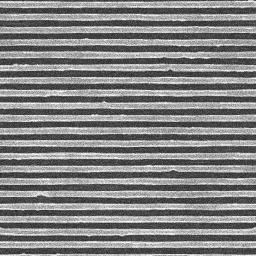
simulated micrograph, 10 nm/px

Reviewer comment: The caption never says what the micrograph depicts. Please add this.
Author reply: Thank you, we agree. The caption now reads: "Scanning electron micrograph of parallel lines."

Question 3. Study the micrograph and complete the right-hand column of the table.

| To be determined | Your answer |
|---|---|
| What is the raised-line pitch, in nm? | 127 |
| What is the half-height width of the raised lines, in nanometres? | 65.3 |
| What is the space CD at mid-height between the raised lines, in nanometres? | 65.3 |